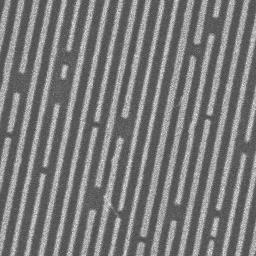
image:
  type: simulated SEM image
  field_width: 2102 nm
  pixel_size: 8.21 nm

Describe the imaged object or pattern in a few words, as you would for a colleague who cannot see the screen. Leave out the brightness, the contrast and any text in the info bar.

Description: parallel lines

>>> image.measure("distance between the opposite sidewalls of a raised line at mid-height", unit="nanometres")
48.3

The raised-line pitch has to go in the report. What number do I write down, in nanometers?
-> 113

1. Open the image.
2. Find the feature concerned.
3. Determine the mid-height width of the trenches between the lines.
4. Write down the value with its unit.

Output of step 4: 64.4 nm